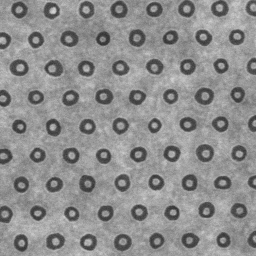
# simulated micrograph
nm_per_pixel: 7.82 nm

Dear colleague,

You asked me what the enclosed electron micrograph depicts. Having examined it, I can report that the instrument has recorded a regular array of ring-shaped grooves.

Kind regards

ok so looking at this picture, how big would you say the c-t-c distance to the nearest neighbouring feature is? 255 nanometres